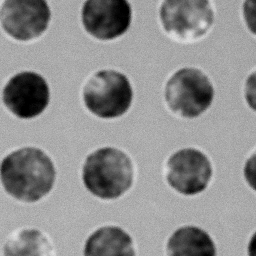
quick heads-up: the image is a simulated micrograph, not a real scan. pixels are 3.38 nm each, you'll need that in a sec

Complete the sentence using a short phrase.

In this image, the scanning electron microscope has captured holes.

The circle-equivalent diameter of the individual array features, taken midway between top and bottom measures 174 nm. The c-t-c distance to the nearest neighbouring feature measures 266 nm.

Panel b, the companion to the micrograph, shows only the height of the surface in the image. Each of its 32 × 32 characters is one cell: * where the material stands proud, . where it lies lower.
......****......****.......***..
......****.......***.......***..
......****.......***.......***..
......****......****......*****.
*....******....******....*******
********************************
********************************
********************************
***********************..*******
*....******.....*****.....*****.
*.....****......*****......****.
......****.......***.......***..
......****.......****......****.
*.....*****.....*****.....*****.
**...*******...*******...*******
********************************
********************************
********************************
**...*******...********..*******
*.....*****.....*****.....*****.
.......***.......****......****.
.......***.......****......***..
.......***.......****.....*****.
.......****.....*****.....*****.
*.....******...********.********
********************************
********************************
********************************
************...*******...*******
*.....*****.....*****.....*****.
*.....*****......****......****.
.......***.......****......****.